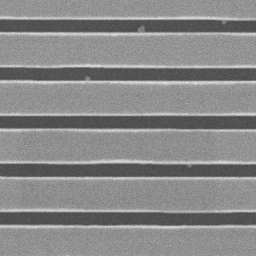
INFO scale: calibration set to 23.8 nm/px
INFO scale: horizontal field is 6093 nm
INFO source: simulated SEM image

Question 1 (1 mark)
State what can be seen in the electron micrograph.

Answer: lines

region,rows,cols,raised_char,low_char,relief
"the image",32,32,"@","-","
@@@@@@@@@@@@@@@@@@@@@@@@@@@@@@@@
@@@@@@@@@@@@@@@@@@@@@@@@@@@@@@@@
--------------------------------
--------------------------------
@@@@@@@@@@@@@@@@@@@@@@@@@@@@@@@@
@@@@@@@@@@@@@@@@@@@@@@@@@@@@@@@@
@@@@@@@@@@@@@@@@@@@@@@@@@@@@@@@@
@@@@@@@@@@@@@@@@@@@@@@@@@@@@@@@@
--------------------------------
--------------------------------
@@@@@@@@@@@@@@@@@@@@@@@@@@@@@@@@
@@@@@@@@@@@@@@@@@@@@@@@@@@@@@@@@
@@@@@@@@@@@@@@@@@@@@@@@@@@@@@@@@
@@@@@@@@@@@@@@@@@@@@@@@@@@@@@@@@
--------------------------------
--------------------------------
@@@@@@@@@@@@@@@@@@@@@@@@@@@@@@@@
@@@@@@@@@@@@@@@@@@@@@@@@@@@@@@@@
@@@@@@@@@@@@@@@@@@@@@@@@@@@@@@@@
@@@@@@@@@@@@@@@@@@@@@@@@@@@@@@@@
--------------------------------
--------------------------------
@@@@@@@@@@@@@@@@@@@@@@@@@@@@@@@@
@@@@@@@@@@@@@@@@@@@@@@@@@@@@@@@@
@@@@@@@@@@@@@@@@@@@@@@@@@@@@@@@@
@@@@@@@@@@@@@@@@@@@@@@@@@@@@@@@@
--------------------@@@@@@------
--------------------------------
@@@@@@@@@@@@@@@@@@@@@@@@@@@@@@@@
@@@@@@@@@@@@@@@@@@@@@@@@@@@@@@@@
@@@@@@@@@@@@@@@@@@@@@@@@@@@@@@@@
@@@@@@@@@@@@@@@@@@@@@@@@@@@@@@@@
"